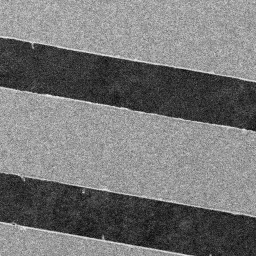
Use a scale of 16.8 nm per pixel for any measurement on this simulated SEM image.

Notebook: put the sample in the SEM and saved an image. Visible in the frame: one or a few lines or trenches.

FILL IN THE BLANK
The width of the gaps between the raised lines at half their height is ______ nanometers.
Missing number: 837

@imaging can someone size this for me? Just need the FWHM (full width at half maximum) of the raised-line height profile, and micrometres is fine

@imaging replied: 1.39